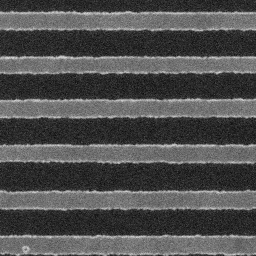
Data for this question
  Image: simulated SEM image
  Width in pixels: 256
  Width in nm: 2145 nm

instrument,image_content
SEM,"lines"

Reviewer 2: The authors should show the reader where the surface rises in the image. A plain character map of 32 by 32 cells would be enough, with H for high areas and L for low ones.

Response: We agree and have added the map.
LLLLLLLLLLLLLLLLLLLLLLLLLLLLLLLL
LLLLLLLLLLLLLLLLLLLLLLLLLLLLLLLL
HHHHHHHHHHHHHHHHHHHHHHHHHHHHHHHH
HHHHHHHHHHHHHHHHHHHHHHHHHHHHHHHH
LLLLLLLLLLLLLLLLLLLLLLLLLLLLLLLL
LLLLLLLLLLLLLLLLLLLLLLLLLLLLLLLL
LLLLLLLLLLLLLLLLLLLLLLLLLLLLLLLL
HHHHHHHHHHHHHHHHHHHHHHHHHHHHHHHH
HHHHHHHHHHHHHHHHHHHHHHHHHHHHHHHH
LLLLLLLLLLLLLLLLLLLLLLLLLLLLLLLL
LLLLLLLLLLLLLLLLLLLLLLLLLLLLLLLL
LLLLLLLLLLLLLLLLLLLLLLLLLLLLLLLL
LLHHHHLLHHHHHHHHHHHHHHHHHHHHHHHH
HHHHHHHHHHHHHHHHHHHHHHHHHHHHHHHH
HHHHHHHHHHHHHHHHHHHHHHHHHHHHHHHH
LLLLLLLLLLLLLLLLLLLLLLLLLLLLLLLL
LLLLLLLLLLLLLLLLLLLLLLLLLLLLLLLL
LLLLLLLLLLLLLLLLLLLLLLLLLLLLLLLL
HHHHHHHHHHHHHHHHHHHHHHHHHHHHHHHH
HHHHHHHHHHHHHHHHHHHHHHHHHHHHHHHH
LLLLLLLLLLLLLLLLLLLLLLLLLLLLLLLL
LLLLLLLLLLLLLLLLLLLLLLLLLLLLLLLL
LLLLLLLLLLLLLLLLLLLLLLLLLLLLLLLL
LLLLLLLLLLLLLLLLLLLLLLLLLLLLLLLL
HHHHHHHHHHHHHHHHHHHHHHHHHHHHHHHH
HHHHHHHHHHHHHHHHHHHHHHHHHHHHHHHH
LLLLLLLLLLLLLLLLLLLLLLLLLLLLLLLL
LLLLLLLLLLLLLLLLLLLLLLLLLLLLLLLL
LLLLLLLLLLLLLLLLLLLLLLLLLLLLLLLL
LHLHLLLLHLLLHLLLLLLLHHLLHLLLHHLL
HHHHHHHHHHHHHHHHHHHHHHHHHHHHHHHH
HHHHHHHHHHHHHHHHHHHHHHHHHHHHHHHH